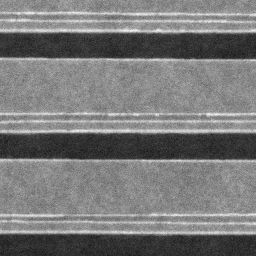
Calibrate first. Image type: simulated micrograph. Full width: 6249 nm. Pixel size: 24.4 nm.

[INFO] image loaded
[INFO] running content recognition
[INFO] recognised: lines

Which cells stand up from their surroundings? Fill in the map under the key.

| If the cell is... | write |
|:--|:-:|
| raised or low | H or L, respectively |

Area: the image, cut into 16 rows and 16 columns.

HHHHHHHHHHHHHHHH
HHHHHHHHHHHHHHHH
LLLLLLLLLLLLLLLL
LLLLLLLLLLLLLLLL
HHHHHHHHHHHHHHHH
HHHHHHHHHHHHHHHH
HHHHHHHHHHHHHHHH
HHHHHHHHHHHHHHHH
LLLLLLLLLLLLLLLL
LLLLLLLLLLLLLLLL
HHHHHHHHHHHHHHHH
HHHHHHHHHHHHHHHH
HHHHHHHHHHHHHHHH
HHHHHHHHHHHHHHHH
LLLLLLHHHHHHHHHH
LLLLLLLLLLLLLLLL